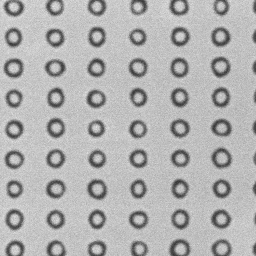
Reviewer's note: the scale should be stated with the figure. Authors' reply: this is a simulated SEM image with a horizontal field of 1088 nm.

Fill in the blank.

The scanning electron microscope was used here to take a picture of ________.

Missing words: a regular array of ring-shaped grooves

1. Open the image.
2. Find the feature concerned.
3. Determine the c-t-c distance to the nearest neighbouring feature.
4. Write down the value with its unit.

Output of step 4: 30.2 px